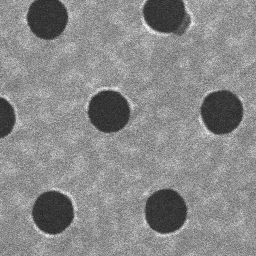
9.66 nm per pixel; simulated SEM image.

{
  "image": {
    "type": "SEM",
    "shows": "holes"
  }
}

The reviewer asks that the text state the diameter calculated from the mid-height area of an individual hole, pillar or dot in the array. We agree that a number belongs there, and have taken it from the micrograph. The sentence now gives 416 nanometres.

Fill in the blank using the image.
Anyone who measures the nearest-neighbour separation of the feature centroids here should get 1090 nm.